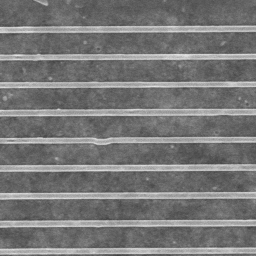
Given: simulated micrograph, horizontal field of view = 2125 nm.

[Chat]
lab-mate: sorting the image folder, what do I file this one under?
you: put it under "parallel lines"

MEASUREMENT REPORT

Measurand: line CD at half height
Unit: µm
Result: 0.0488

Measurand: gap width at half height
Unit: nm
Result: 185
